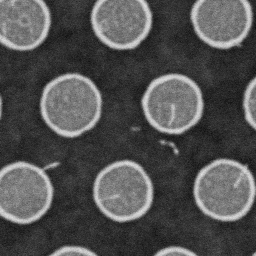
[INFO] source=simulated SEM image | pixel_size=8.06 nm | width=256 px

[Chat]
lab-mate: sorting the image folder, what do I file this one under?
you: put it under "raised bodies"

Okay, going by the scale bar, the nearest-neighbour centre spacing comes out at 809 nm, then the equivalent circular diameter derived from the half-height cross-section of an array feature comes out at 458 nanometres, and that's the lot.